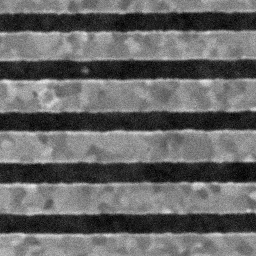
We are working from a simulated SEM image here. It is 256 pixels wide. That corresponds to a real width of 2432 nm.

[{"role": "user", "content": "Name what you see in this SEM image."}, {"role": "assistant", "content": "lines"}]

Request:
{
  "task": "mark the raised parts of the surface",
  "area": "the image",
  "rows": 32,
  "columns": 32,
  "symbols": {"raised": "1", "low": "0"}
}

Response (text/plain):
11111111111111111111111111111111
11111111111111111011101000001000
00000000000000000000000000000000
00000000000000000000000000000000
11111111111111111111111111111111
11111111111111111111111111111111
11111111111111111111111111111111
11011000011100000000000000000000
00000000000000000000000000000000
00000000000000000000000000000000
11111111111111111111111111111111
11111111111111111111111111111111
11111111111111111111111111111111
11111111111111111111111111111111
00000000000000000000000000000000
00000000000000000000000000000000
11111111111111111111111111111111
11111111111111111111111111111111
11111111111111111111111111111111
11111111111111111111111111111111
00000000000000000000000000000000
00000000000000000000000000000000
00000000000000000000000000000000
11111111111111111111111111111111
11111111111111111111111111111111
11111111111111111111111111111111
11111111111111111111111111111010
00000000000000000000000000000000
00000000000000000000000000000000
11111111111111111111111111111111
11111111111111111111111111111111
11111111111111111111111111111111